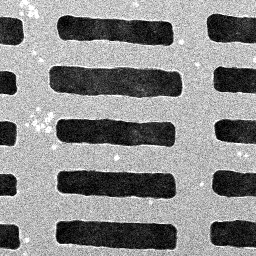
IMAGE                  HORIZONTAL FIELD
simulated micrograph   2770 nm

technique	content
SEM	holes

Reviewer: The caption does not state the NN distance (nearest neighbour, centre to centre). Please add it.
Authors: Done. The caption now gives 549 nm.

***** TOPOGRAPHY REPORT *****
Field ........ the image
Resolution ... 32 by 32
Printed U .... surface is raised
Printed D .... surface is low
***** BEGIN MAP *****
UUUUUUUUUUUUUUUUUUUUUUUUUUUUUUUU
UUUUUUUUUUUUUUUUUUUUUUUUUUUUUUUU
DDUUUUUDDDDDDDDUDUUUUUUUUUDDDDDD
DDDUUUUDDDDDDDDDDDDDDDUUUUDDDDDD
DDDUUUUDDDDDDDDDDDDDDDUUUUDDDDDD
DDUUUUUUUUUUUUUUUUDDDUUUUUUUUUUU
UUUUUUUUUUUUUUUUUUUUUUUUUUUUUUUU
UUUUUUUUUUUUUUUUUUUUUUUUUUUUUUUU
UUUUUUUDDDDDUUDDUUUUUUUUUUUDDDDD
DDUUUUDDDDDDDDDDDDDDDDDUUUUDDDDD
DDUUUUDDDDDDDDDDDDDDDDDUUUUDDDDD
DDUUUUUDDDDDDDDDDDDDDDDUUUUUDDDD
UUUUUUUUUUUUUUUUUUUUUUUUUUUUUUUU
UUUUUUUUUUUUUUUUUUUUUUUUUUUUUUUU
UUUUUUUUUUUUUUUUUUUUUUUUUUUUUUUU
DDUUUUUDDDDDDDDDDDDDDDUUUUUDDDDD
DDUUUUUDDDDDDDDDDDDDDDUUUUUDDDDD
DDUUUUUDDDDDDDDDDDDDDDUUUUUDDDDD
UUUUUUUUUUUUUUUUUUUUUUUUUUUUUUUU
UUUUUUUUUUUUUUUUUUUUUUUUUUUUUUUU
UUUUUUUUUUUUUUUUUUUUUUUUUUUUUUUU
UUUUUUUUDDDDDDDDUUUUUUUUUUUDDDUU
DDUUUUUDDDDDDDDDDDDDDDUUUUDDDDDD
DDUUUUUDDDDDDDDDDDDDDDUUUUUDDDDD
UUUUUUUUUUUUDDDDDDDDDDUUUUUUDDDU
UUUUUUUUUUUUUUUUUUUUUUUUUUUUUUUU
UUUUUUUUUUUUUUUUUUUUUUUUUUUUUUUU
UUUUUUUUUUUUUUUUUUUUUUUUUUUUUUUU
DDUUUUUDDDDDDDDDDDDDDDUUUUDDDDDD
DDUUUUUDDDDDDDDDDDDDDDUUUUDDDDDD
DDDUUUUUUDDDDDDDDDDDDDUUUUUDDDDD
UUUUUUUUUUUUUUUUUUUUUUUUUUUUUUUU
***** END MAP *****